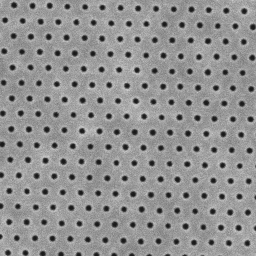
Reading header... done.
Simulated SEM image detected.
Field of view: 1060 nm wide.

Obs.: a regular array of holes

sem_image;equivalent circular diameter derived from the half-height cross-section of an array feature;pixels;6.09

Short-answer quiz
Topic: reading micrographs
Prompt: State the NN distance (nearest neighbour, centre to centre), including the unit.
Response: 71.6 nm